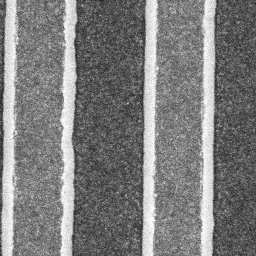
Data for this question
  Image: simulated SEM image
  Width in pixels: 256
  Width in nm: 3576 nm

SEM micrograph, one or a few lines or trenches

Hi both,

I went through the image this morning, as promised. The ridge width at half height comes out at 842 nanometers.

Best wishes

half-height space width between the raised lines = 1110 nm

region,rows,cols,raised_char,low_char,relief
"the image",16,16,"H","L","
LHHHLLLLLHHHHLLL
LHHHLLLLLHHHHLLL
LHHHLLLLLHHHHLLL
LHHHLLLLLHHHHLLL
LHHHLLLLLHHHHLLL
LHHHLLLLLHHHHLLL
LHHHLLLLLHHHHLLL
HHHHLLLLLHHHHLLL
LHHHLLLLLHHHHLLL
LHHHLLLLLHHHHLLL
LHHHLLLLLHHHHLLL
HHHHLLLLLHHHHLLL
HHHHLLLLLHHHHLLL
HHHHLLLLLHHHHLLL
HHHHLLLLLHHHHLLL
HHHHLLLLLHHHHLLL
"